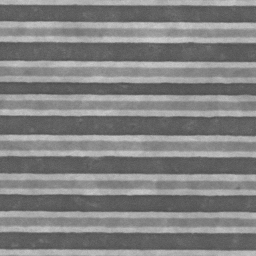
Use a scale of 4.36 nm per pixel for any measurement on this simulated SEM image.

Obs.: parallel lines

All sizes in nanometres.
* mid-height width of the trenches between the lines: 98.7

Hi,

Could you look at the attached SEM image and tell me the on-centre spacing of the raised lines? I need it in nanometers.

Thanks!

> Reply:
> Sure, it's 166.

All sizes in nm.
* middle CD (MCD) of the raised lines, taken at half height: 68.7